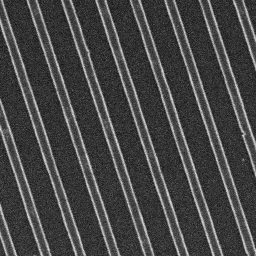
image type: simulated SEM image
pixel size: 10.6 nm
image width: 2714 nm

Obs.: parallel lines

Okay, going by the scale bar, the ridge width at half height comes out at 93.2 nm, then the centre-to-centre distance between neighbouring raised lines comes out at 0.347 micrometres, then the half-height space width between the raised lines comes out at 0.25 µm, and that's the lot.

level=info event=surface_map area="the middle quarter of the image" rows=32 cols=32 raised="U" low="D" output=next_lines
DDDDDUUDDDDDDUUUDDDDDDUUDDDDDDUU
DDDDDUUDDDDDDDUUDDDDDDUUUDDDDDDU
DDDDDUUUDDDDDDUUDDDDDDDUUDDDDDDU
DDDDDDUUDDDDDDUUUDDDDDDUUDDDDDDU
DDDDDDUUDDDDDDDUUDDDDDDUUUDDDDDD
DDDDDDUUUDDDDDDUUDDDDDDDUUDDDDDD
UDDDDDDUUDDDDDDUUUDDDDDDUUDDDDDD
UDDDDDDUUDDDDDDDUUDDDDDDUUUDDDDD
UDDDDDDUUUDDDDDDUUDDDDDDDUUDDDDD
UUDDDDDDUUDDDDDDUUUDDDDDDUUDDDDD
UUDDDDDDUUDDDDDDDUUDDDDDDUUUDDDD
UUDDDDDDUUUDDDDDDUUDDDDDDDUUDDDD
UUDDDDDDDUUDDDDDDUUDDDDDDDUUDDDD
DUUDDDDDDUUDDDDDDUUUDDDDDDUUUDDD
DUUDDDDDDUUUDDDDDDUUDDDDDDDUUDDD
DUUDDDDDDDUUDDDDDDUUDDDDDDDUUDDD
DDUUDDDDDDUUDDDDDDUUUDDDDDDUUUDD
DDUUDDDDDDUUUDDDDDDUUDDDDDDUUUDD
DDUUDDDDDDDUUDDDDDDUUDDDDDDDUUDD
DDUUUDDDDDDUUDDDDDDUUUDDDDDDUUDD
DDDUUDDDDDDUUUDDDDDDUUDDDDDDUUUD
DDDUUDDDDDDDUUDDDDDDUUDDDDDDDUUD
DDDUUUDDDDDDUUDDDDDDUUUDDDDDDUUD
DDDDUUDDDDDDUUUDDDDDDUUDDDDDDUUU
DDDDUUDDDDDDDUUDDDDDDUUDDDDDDDUU
DDDDUUUDDDDDDUUDDDDDDUUUDDDDDDUU
DDDDDUUDDDDDDUUUDDDDDDUUDDDDDDUU
DDDDDUUDDDDDDDUUDDDDDDUUDDDDDDDU
DDDDDUUDDDDDDDUUDDDDDDUUUDDDDDDU
DDDDDUUUDDDDDDUUUDDDDDDUUDDDDDDU
DDDDDDUUDDDDDDDUUDDDDDDUUDDDDDDD
DDDDDDUUDDDDDDDUUDDDDDDUUUDDDDDD